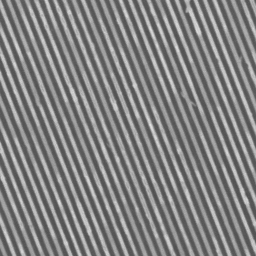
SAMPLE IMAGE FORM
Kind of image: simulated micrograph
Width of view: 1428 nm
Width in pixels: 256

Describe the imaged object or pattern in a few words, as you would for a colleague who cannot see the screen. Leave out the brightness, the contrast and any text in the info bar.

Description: parallel lines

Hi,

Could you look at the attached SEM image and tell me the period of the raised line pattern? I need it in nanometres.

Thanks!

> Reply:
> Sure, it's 48.6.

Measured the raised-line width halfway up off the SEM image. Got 0.0195 micrometres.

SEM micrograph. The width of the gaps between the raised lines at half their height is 29.2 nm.